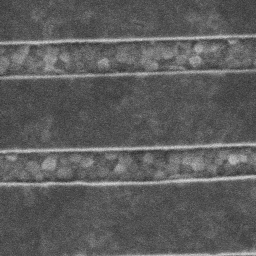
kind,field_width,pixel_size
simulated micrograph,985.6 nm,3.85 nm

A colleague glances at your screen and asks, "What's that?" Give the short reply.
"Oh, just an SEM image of one or a few lines or trenches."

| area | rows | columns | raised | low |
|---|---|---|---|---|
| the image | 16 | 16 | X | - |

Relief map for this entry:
XXXXXXXXXXXXXXXX
XXXXXXXXXXXXXXXX
XXXXXXXX--------
----------------
-----------XXXXX
XXXXXXXXXXXXXXXX
XXXXXXXXXXXXXXXX
XXXXXXXXXXXXXXXX
XXXXXXXXXXXXXXXX
----------------
----------------
X--XXX-XXXXXXXXX
XXXXXXXXXXXXXXXX
XXXXXXXXXXXXXXXX
XXXXXXXXXXXXXXXX
XXXXXXXXXXXXXXXX